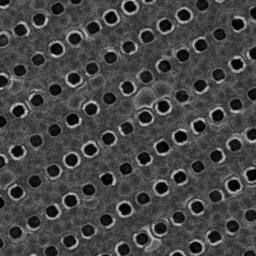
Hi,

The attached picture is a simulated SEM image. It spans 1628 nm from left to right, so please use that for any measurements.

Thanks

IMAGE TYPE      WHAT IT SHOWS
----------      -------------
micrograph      a regular array of holes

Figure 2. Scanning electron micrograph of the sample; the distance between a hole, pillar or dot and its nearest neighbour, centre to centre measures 134 nm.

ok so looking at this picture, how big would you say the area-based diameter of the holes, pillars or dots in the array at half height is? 79.9 nanometers